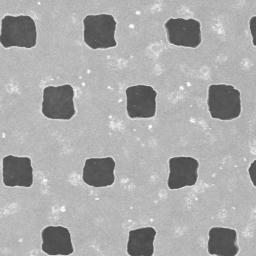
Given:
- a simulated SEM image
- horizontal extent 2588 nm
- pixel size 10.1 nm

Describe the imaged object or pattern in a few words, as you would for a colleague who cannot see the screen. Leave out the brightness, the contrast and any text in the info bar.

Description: a regular array of holes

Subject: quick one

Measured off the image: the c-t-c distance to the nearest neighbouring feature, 818 nanometres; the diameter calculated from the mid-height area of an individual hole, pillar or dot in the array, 333 nanometers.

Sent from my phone